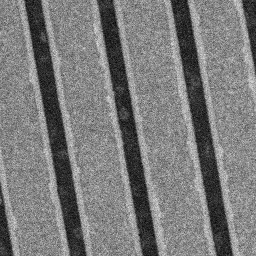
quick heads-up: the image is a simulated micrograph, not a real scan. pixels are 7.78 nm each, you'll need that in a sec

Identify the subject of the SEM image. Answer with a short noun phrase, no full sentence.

one or a few lines or trenches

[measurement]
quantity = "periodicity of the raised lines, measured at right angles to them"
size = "558 nm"